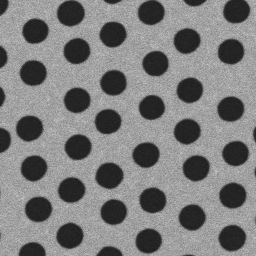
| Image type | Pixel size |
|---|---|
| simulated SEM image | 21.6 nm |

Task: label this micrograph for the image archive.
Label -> a regular array of holes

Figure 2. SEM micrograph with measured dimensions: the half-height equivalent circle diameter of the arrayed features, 566 nm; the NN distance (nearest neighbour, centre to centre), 865 nm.